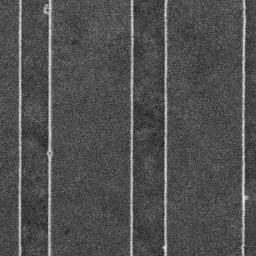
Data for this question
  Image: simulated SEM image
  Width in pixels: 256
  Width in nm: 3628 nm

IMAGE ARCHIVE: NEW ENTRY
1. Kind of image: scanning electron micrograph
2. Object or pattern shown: one or a few lines or trenches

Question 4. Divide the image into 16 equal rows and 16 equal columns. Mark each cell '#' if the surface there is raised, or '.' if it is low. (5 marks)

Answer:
#..#####..#####.
#..#####..#####.
#..#####..#####.
#..#####..#####.
#..#####..#####.
#..#####..#####.
#..#####..#####.
#..#####..#####.
#..#####..#####.
#..#####..#####.
#..#####..#####.
#..#####..#####.
#..#####..#####.
#..#####..#####.
#..#####..#####.
#..#####..#####.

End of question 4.